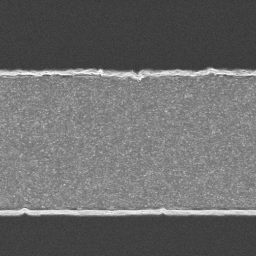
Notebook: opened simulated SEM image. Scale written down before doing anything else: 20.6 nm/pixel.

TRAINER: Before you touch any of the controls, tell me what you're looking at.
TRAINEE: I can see one or a few lines or trenches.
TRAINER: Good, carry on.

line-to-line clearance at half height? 2870 nanometres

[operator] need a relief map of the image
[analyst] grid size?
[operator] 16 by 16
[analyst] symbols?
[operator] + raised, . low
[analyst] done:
++++++++++++++++
++++++++++++++++
++++++++++++++++
++++++++++++++++
+++++++++++++.++
................
................
................
................
................
................
................
................
++++++++++++++++
++++++++++++++++
++++++++++++++++